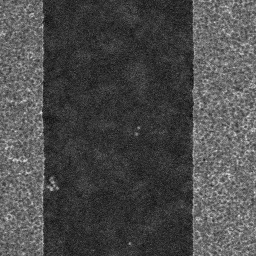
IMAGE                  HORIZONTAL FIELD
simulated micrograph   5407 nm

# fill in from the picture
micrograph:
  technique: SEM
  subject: one or a few lines or trenches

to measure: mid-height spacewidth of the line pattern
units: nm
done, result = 3180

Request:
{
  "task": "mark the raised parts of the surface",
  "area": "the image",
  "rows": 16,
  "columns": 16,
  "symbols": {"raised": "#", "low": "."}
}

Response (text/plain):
###.........####
###.........####
###.........####
###.........####
###.........####
###.........####
###.........####
###.........####
###.........####
###.........####
###.........####
###.........####
###.........####
###.........####
###.........####
###.........####